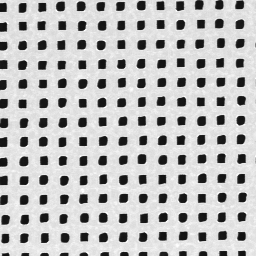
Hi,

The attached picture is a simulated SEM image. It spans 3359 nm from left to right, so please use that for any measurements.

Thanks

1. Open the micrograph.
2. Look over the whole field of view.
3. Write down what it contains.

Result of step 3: a regular array of holes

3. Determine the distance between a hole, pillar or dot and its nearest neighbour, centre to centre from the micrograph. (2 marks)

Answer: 246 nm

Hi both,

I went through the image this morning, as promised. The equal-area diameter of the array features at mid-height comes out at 0.128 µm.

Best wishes